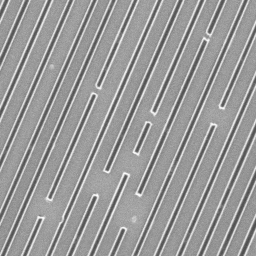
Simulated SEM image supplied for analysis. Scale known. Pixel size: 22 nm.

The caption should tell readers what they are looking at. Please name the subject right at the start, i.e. parallel lines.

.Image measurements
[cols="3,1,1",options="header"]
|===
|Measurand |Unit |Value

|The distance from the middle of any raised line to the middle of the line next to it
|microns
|0.441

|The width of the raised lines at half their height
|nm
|129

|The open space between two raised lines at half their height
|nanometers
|316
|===